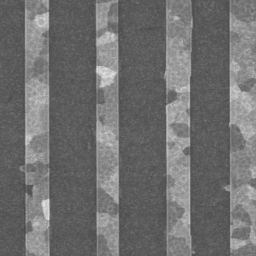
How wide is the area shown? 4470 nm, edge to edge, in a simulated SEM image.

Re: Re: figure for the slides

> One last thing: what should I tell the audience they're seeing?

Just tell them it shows one or a few lines or trenches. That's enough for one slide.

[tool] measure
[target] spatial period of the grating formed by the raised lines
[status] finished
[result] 1240 nanometers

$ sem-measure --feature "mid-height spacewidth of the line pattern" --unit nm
851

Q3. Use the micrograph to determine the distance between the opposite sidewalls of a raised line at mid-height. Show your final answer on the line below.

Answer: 386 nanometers